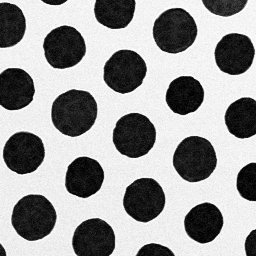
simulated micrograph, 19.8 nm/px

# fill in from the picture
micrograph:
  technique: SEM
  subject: a regular array of holes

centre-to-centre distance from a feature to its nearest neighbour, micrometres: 1.27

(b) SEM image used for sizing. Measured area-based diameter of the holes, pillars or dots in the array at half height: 858 nm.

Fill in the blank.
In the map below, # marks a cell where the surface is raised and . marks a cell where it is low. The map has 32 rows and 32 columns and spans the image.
..####..####.....########......#
...#########.....###...###....##
...#########....####....########
...####..#####..###......#######
...###....#########......###...#
..###......#########....###.....
#####......####..####..####.....
######....###.....#########.....
#.#####.#####.....#########....#
....#########.....##############
....#########.....###....#######
....####...####.#####.....######
....###.....#########....#####..
#..###......#########....###....
######......###...##########....
#######.....##.....#########....
##.#####...###.....##########...
#....#########.....####...######
......########.....###.....#####
......##########..####.....#####
#....####...##########.....####.
##..####.....#########.....###..
########.....####..####..#####..
########.....###....##########..
###..#####.####......#########..
##....#########......####..#####
##.....#########....####....####
#......####..####..####.....####
##.....###....#########.....####
###...###.....##########...####.
#########.....####..###########.
.########.....###.....#########.